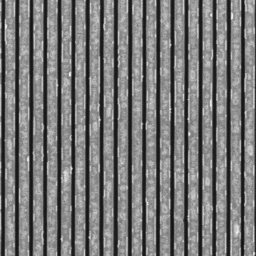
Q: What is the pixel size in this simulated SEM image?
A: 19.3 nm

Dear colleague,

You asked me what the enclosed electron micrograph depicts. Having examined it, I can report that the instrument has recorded parallel lines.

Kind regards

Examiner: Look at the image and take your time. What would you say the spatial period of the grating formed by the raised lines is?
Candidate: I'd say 272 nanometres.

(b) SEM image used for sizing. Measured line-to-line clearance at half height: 70.1 nm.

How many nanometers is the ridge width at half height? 193